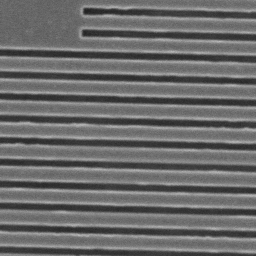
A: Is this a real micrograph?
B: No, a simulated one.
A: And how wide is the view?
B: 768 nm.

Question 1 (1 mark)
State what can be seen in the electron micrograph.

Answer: parallel lines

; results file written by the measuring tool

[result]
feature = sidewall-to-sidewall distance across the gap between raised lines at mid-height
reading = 20.6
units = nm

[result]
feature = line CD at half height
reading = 44.3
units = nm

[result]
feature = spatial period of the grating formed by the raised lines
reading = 65.8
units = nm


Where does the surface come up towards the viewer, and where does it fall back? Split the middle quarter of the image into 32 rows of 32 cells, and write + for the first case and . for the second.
++++++++++++++++++++++++++++++++
++++++++++++++++++++++++++++++++
.................+++++++++++++++
................................
+++++++++++++++++++.............
++++++++++++++++++++++++++++++++
++++++++++++++++++++++++++++++++
..++++++++++++++++++++++++++++++
................................
................................
++++++++++++++++++++++++++++++++
++++++++++++++++++++++++++++++++
++++++++++++++++++++++++++++++++
.................+++++++++++++++
................................
+++++++++++++++++++.............
++++++++++++++++++++++++++++++++
++++++++++++++++++++++++++++++++
++++++++++++++++++++++++++++++++
................................
................................
++++++++++++++++++++++++++++++++
++++++++++++++++++++++++++++++++
++++++++++++++++++++++++++++++++
..................+++...++++++++
................................
+++++++++++++++++++.............
++++++++++++++++++++++++++++++++
++++++++++++++++++++++++++++++++
...+++++++++++++++++++++++++++++
................................
++++............................